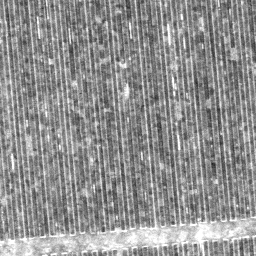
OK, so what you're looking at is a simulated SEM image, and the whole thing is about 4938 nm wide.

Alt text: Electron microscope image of parallel lines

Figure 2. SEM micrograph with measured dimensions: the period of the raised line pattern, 195 nm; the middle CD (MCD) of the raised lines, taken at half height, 110 nm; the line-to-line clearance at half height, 91.2 nm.